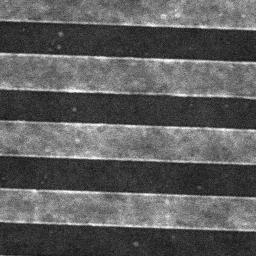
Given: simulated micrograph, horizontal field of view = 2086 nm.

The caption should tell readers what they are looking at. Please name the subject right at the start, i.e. one or a few lines or trenches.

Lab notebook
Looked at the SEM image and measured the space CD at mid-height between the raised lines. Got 275 nanometers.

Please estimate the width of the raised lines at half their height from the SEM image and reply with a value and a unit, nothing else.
276 nm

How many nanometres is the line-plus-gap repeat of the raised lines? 546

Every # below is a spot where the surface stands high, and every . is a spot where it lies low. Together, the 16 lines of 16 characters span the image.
################
.......#########
................
###.............
################
################
................
................
################
################
................
................
################
################
................
................